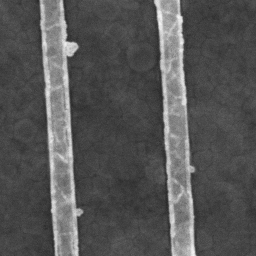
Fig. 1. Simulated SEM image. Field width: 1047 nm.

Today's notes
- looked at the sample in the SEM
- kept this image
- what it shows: one or a few lines or trenches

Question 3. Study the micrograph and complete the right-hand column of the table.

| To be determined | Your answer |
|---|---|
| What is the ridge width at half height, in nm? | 90.7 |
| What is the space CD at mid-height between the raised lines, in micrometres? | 0.383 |